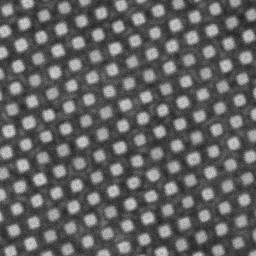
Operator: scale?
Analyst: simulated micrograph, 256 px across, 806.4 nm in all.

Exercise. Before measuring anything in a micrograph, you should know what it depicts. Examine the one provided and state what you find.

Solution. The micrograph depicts a regular array of raised bodies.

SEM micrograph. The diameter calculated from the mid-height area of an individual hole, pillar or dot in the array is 37.3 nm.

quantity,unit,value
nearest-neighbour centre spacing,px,21.3